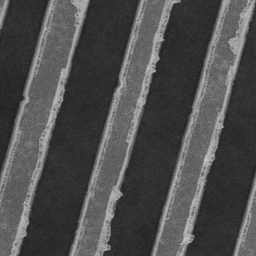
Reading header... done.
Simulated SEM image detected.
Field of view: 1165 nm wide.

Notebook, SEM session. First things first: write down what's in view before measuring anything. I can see one or a few lines or trenches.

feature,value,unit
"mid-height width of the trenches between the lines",236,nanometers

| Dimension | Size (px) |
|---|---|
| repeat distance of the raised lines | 81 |